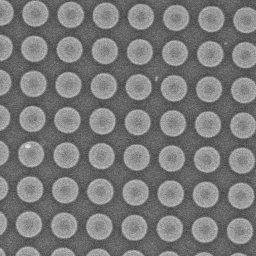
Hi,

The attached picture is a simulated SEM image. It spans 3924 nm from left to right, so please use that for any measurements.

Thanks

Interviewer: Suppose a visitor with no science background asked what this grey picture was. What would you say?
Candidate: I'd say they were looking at an array of small figures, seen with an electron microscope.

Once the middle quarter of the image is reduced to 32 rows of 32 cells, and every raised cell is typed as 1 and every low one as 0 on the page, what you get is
00000000000000000000000000000000
00000000000000000000000000000000
11000000000000000000000000000000
11110000111100000111100000111000
11110001111110001111100001111100
11110001111110001111110011111110
11110001111110001111110011111110
11100000111100001111100001111100
00000000011000000111000001111100
00000000000000000000000000000000
00000000000000000000000000000000
11100000111000000000000000000000
11100001111100001111100001111000
11110001111110001111100011111100
11110001111110011111100011111100
11110001111110011111100011111100
11100001111100001111100001111100
00000000000000000110000000111000
00000000000000000000000000000000
00000000000000000000000000000000
11100000111000000110000000000000
11100001111100001111100001111000
11110011111100011111100011111100
11100011111100011111100011111100
11100001111100011111100011111100
11000001111000001111100011111000
00000000000000000000000000110000
00000000000000000000000000000000
00000000000000000000000000000000
11100001111000001110000001110000
11100011111100011111100011111000
11100011111100011111100011111100